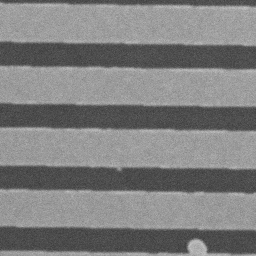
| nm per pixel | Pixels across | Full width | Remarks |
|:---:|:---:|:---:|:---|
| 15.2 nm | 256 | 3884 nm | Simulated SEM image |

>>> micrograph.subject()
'lines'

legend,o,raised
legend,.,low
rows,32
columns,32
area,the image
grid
o...............................
oooooooooooooooooooooooooooooooo
oooooooooooooooooooooooooooooooo
oooooooooooooooooooooooooooooooo
oooooooooooooooooooooooooooooooo
.......................ooooooooo
................................
................................
ooooooooooooo.o.................
oooooooooooooooooooooooooooooooo
oooooooooooooooooooooooooooooooo
oooooooooooooooooooooooooooooooo
oooooooooooooooooooooooooooooooo
................................
................................
................................
oooooooooooooooooooooooooooooooo
oooooooooooooooooooooooooooooooo
oooooooooooooooooooooooooooooooo
oooooooooooooooooooooooooooooooo
oooooooooooooooooooooooooooooooo
................................
................................
................................
oooooooooooooooooooooooooooooooo
oooooooooooooooooooooooooooooooo
oooooooooooooooooooooooooooooooo
oooooooooooooooooooooooooooooooo
................oooooooooooooooo
................................
........................o.......
oooooo..................oo......